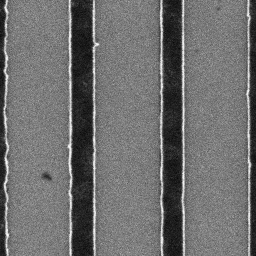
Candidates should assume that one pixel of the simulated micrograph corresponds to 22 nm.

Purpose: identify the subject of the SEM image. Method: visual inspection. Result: one or a few lines or trenches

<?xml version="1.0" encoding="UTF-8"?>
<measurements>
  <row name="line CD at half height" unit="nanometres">514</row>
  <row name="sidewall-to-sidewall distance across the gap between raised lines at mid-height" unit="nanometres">1430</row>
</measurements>